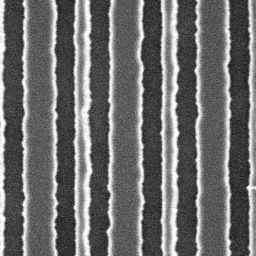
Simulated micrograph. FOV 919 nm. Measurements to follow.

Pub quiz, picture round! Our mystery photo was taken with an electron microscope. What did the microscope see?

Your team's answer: lines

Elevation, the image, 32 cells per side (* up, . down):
...****..**...****..**...****..*
...****..**...****..**...****..*
...****..**...****..**...****..*
...****..**...****..**...****..*
...****..**...****..**...****..*
...****..**...****..**...****..*
...****...*...***...**...****..*
...****..**...****..**...****..*
...****..**...****..**..****...*
...****..**...****..**...****..*
...****..**...****..**...****..*
...****..**...****..**...****..*
...****..**...****..**...****..*
...****..**...****..**...****..*
...****..**...****..**...****..*
*..****..**...****..**...****..*
...****...*...****..**...****..*
...****..**...****..**...****..*
...****..**...****..**...****..*
...****..**...****..**...****..*
...****..**...****..**...***...*
...****..**...****..**...****..*
...****..**...****..**...****..*
...****..**...****..**...****..*
...****..**...****..**...****..*
...****..**...****..**...****..*
...****..**...****..**...****..*
...****...*...****..**...****..*
...****...*...****..**...****..*
...****...*...****..**...****..*
...****..**...****..**...****..*
...****...*...****..**...****..*